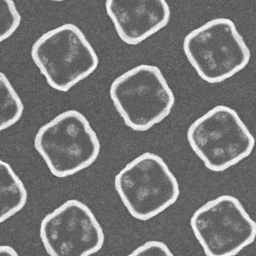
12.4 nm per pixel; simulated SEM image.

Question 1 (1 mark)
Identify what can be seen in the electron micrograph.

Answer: raised bodies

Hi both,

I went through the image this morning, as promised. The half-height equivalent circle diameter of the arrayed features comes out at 0.715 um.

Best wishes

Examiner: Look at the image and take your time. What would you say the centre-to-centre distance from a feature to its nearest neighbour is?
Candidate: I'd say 1090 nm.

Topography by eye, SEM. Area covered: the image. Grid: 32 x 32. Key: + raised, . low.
+.............+++++++...........
++............+++++++...........
++............+++++++...........
++......+......+++++......+++...
+.....++++.....+++......++++++..
.....++++++............+++++++..
....+++++++............++++++++.
.....+++++++............+++++++.
.....+++++++.....++......+++++..
......++++......++++.....+++....
+......++.....+++++++...........
+.............+++++++...........
++............+++++++...........
++.............++++++...........
++......++.....+++++......+++...
+.....+++++.....+++.....++++++..
.....++++++.............+++++++.
.....+++++++............+++++++.
.....+++++++............+++++++.
......++++++.............+++++..
+.....+++++......+++......+++...
+......++......++++++...........
++.............+++++++..........
+++............+++++++..........
+++............+++++++..........
+++......+......+++++.....++++..
+......++++......+++.....+++++..
......++++++............+++++++.
.....+++++++............++++++++
.....++++++++............+++++++
......++++++.............++++++.
+......++++......++++.....+++...